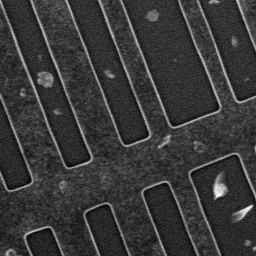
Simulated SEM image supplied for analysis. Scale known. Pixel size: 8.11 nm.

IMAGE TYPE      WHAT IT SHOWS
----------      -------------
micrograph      groups of lines, slits or small figures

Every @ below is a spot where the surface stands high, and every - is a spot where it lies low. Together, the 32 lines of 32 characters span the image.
----@@@@@----@@-------@@@-----@@
@---@@@@@----@@@-------@@-----@@
@----@@@@----@@@-------@@@-----@
@----@@@@@----@@--------@@-----@
@@----@@@@----@@@-------@@-----@
@@----@@@@----@@@-------@@@-----
@@----@@@@@----@@@-------@@-----
@@@----@@@@----@@@-------@@@----
@@@----@@@@@----@@--------@@----
@@@@----@@@@----@@@-------@@----
@@@@----@@@@----@@@-------@@@---
@@@@----@@@@@----@@@-------@@---
@@@@@----@@@@----@@@-------@@@-@
-@@@@----@@@@@---@@@-------@@@@@
-@@@@@---@@@@@----@@@-----@@@@@@
-@@@@@----@@@@----@@@--@@@@@@@@@
--@@@@----@@@@@----@@@@@@@@@@@@@
--@@@@@----@@@@---@@@@@@@@@@@@@@
---@@@@----@@@@@@@@@@@@@@@@@@@@@
---@@@@@---@@@@@@@@@@@@@@@@@@-@@
---@@@@@--@@@@@@@@@@@@@@@@----@@
----@@@@@@@@@@@@@@@@@@@@-------@
----@@@@@@@@@@@@@@@@@@@@-------@
@-@@@@@@@@@@@@@@@@---@@@---@---@
@@@@@@@@@@@@@@@@@@----@@@-------
@@@@@@@@@@@@@@@@@@----@@@-------
@@@@@@@@@@@---@@@@@----@@-----@-
@@@@@@@@@@@---@@@@@----@@@------
@@@@@-@@@@@----@@@@----@@@------
@@@----@@@@----@@@@@----@@@-----
@@@----@@@@@----@@@@----@@@-----
@@@@----@@@@----@@@@@----@@-----